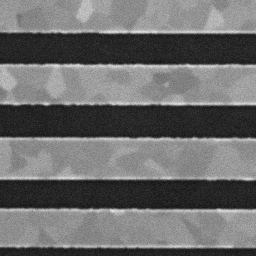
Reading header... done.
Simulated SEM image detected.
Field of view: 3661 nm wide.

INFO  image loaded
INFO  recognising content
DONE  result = lines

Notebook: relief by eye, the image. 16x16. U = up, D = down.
UUUUUUUUUUUUUUUU
UUUUUUUUUUUUUUUU
DDDDDDDDDDDDDDDD
DDDDDDDDDDDDDDDD
UUUUUUUUUUUUUUUU
UUUUUUUUUUUUUUUU
UUUUUUUUUUUUUUUU
DDDDDDDDDDDDDDDD
DDDDDDDDDDDDDDDD
UUUUUUUUUUUUUUUU
UUUUUUUUUUUUUUUU
DDDDDDDDDDDDDDDD
DDDDDDDDDDDDDDDD
UUUUUUUUUUUUUUUU
UUUUUUUUUUUUUUUU
DDDDDDDDDDDDDDDD